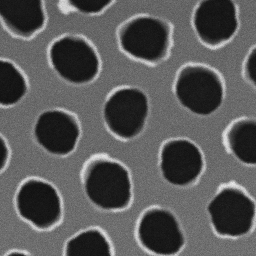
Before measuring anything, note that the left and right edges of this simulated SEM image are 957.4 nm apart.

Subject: a regular array of holes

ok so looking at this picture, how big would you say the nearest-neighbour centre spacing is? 270 nm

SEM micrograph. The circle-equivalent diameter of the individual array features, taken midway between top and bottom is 163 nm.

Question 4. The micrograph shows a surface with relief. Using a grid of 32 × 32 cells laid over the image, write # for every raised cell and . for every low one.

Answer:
.....####....############....###
.....######.#############....###
#....############..#####......##
##...###########.....####.....##
###############......####....###
#######....####......###########
######......####....############
######......###################.
..#####.....############.######.
...#####....###########....####.
...###################.....#####
...############...####......####
..############....####......####
#############.....######...#####
#####...#####.....##############
#####....#####....############..
####......####...############...
#####.....############.######...
.#####...############....####...
.###################.....#####..
############...#####.....#######
###########.....####.....#######
###########.....#####...########
###....####.....################
##.....####.....###########....#
##.....#####....##########......
###....############..#####......
####...###########....####.....#
#################.....#####....#
##########...#####.....#########
#########....#####.....#########
########......#####...##########